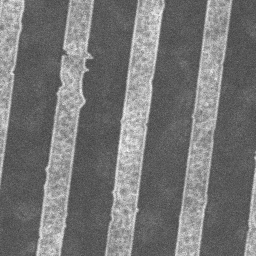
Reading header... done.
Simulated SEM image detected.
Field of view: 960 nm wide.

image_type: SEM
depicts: one or a few lines or trenches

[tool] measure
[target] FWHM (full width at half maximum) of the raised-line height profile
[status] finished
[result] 80.8 nm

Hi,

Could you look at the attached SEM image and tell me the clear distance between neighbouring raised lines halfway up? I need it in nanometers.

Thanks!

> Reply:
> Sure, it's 173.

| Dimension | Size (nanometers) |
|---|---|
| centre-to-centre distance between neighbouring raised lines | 257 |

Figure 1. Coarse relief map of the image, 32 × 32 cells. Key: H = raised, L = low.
HHHLLLLLLHHLLLLLLHHHLLLLLLHHHLLL
HHHLLLLLLHHLLLLLLHHHLLLLLLHHHLLL
HHHLLLLLLHHLLLLLLHHHLLLLLLHHHLLL
HHHLLLLLHHHLLLLLLHHHLLLLLLHHLLLL
HHLLLLLLHHHLLLLLLHHHLLLLLLHHLLLL
HHLLLLLLHHHLLLLLLHHHLLLLLHHHLLLL
HHLLLLLLHHHLLLLLHHHLLLLLLHHHLLLL
HHLLLLLLHHHLLLLLHHHLLLLLLHHHLLLL
HHLLLLLLHHHLLLLLHHHLLLLLLHHHLLLL
HHLLLLLLHHLLLLLLHHHLLLLLLHHHLLLL
HHLLLLLLHHLLLLLLHHHLLLLLLHHLLLLL
HLLLLLLHHHLLLLLLHHHLLLLLLHHLLLLL
HLLLLLLHHHLLLLLLHHHLLLLLLHHLLLLL
HLLLLLLHHHLLLLLLHHHLLLLLHHHLLLLL
HLLLLLLHHHLLLLLHHHLLLLLLHHHLLLLL
HLLLLLLHHHLLLLLHHHLLLLLLHHHLLLLL
HLLLLLLHHLLLLLLHHHLLLLLLHHHLLLLL
HLLLLLLHHLLLLLLHHHLLLLLLHHHLLLLL
HLLLLLHHHLLLLLLHHHLLLLLLHHLLLLLL
LLLLLLHHHLLLLLLHHHLLLLLLHHLLLLLL
LLLLLLHHHLLLLLLHHHLLLLLHHHLLLLLL
LLLLLLHHHLLLLLLHHHLLLLLHHHLLLLLL
LLLLLLHHHLLLLLLHHLLLLLLHHHLLLLLL
LLLLLLHHHLLLLLHHHLLLLLLHHHLLLLLL
LLLLLLHHLLLLLLHHHLLLLLLHHHLLLLLL
LLLLLHHHLLLLLLHHHLLLLLLHHHLLLLLL
LLLLLHHHLLLLLLHHHLLLLLLHHLLLLLLH
LLLLLHHHLLLLLLHHHLLLLLLHHLLLLLLH
LLLLLHHHLLLLLLHHHLLLLLHHHLLLLLLH
LLLLLHHHLLLLLLHHHLLLLLHHHLLLLLLH
LLLLLHHHLLLLLHHHLLLLLLHHHLLLLLLH
LLLLLHHLLLLLLHHHLLLLLLHHHLLLLLLH